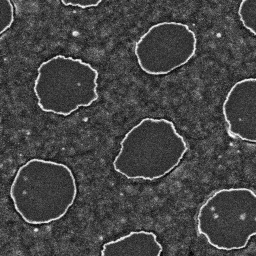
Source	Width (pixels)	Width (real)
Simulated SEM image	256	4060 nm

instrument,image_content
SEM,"raised bodies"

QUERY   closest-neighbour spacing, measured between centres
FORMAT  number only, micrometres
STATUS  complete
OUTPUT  1.67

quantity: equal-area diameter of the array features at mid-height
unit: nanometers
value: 971